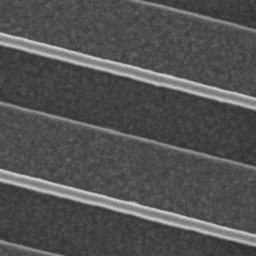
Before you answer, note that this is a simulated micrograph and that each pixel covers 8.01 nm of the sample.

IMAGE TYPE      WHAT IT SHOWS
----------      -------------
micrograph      lines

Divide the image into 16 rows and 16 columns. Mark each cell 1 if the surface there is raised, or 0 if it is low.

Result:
1111111111100000
1111111111111100
1111111111111111
0001111111111111
0000000111111111
0000000000011111
0000000000000001
1111000000000000
1111111100000000
1111111111110000
1111111111111111
0111111111111111
0000011111111111
0000000001111111
0000000000000111
1100000000000000